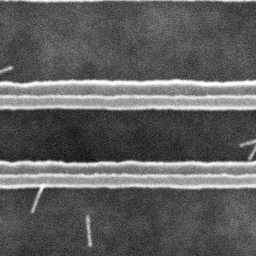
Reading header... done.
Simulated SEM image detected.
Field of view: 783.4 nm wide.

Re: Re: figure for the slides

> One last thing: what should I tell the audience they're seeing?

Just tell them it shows lines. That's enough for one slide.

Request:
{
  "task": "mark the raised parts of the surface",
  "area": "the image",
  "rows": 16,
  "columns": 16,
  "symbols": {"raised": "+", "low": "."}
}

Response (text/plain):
................
................
................
................
................
++++++++++++++++
++++++++++++++++
................
................
................
++++++++++++++++
++++++++++++++++
................
................
................
................